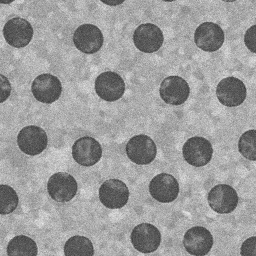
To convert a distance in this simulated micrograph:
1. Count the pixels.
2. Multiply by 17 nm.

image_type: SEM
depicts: a regular array of holes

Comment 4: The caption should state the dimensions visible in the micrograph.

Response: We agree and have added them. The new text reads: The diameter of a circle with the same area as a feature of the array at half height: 529 nanometers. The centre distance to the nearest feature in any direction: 0.909 microns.